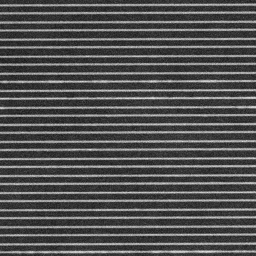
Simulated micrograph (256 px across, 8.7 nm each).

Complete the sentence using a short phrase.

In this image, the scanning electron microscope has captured parallel lines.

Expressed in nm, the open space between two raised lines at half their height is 63.1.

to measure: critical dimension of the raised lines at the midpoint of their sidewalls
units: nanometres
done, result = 13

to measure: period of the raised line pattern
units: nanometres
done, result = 74